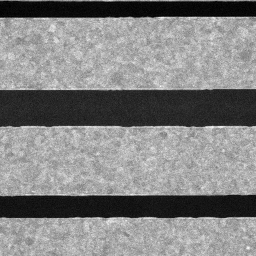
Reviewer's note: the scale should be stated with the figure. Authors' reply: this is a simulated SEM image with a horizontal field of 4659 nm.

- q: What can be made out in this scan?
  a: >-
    lines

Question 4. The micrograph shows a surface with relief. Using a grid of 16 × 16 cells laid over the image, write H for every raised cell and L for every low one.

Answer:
LLLLLLLLLLLLLLLL
HHHHHHHHHHHHHHHH
HHHHHHHHHHHHHHHH
HHHHHHHHHHHHHHHH
HHHHHHHHHHHHHHHH
HHHHHHHHHHHHHHHH
LLLLLLLLLLLLLLLL
LLLLLLLLLLLLLLLL
HHHHHHHHHHHHHHHH
HHHHHHHHHHHHHHHH
HHHHHHHHHHHHHHHH
HHHHHHHHHHHHHHHH
LLLLLLLLLLLLLLLL
LLLLLLLLLLLLLLLL
HHHHHHHHHHHHHHHH
HHHHHHHHHHHHHHHH